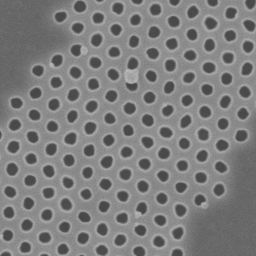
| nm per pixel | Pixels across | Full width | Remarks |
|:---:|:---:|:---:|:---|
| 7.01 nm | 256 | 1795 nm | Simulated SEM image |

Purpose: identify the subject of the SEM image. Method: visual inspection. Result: a regular array of holes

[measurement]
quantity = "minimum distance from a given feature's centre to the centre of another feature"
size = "149 nm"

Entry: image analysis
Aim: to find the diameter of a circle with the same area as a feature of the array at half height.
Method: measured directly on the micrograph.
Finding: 11.8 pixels